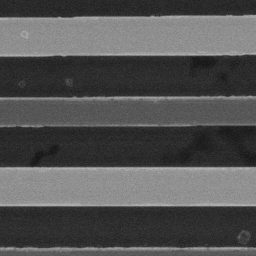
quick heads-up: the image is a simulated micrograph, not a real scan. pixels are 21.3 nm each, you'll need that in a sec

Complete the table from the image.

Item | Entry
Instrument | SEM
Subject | lines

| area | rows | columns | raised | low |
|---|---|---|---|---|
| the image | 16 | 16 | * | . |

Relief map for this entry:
................
****************
****************
................
................
................
****************
****************
................
................
****************
****************
****************
................
................
................